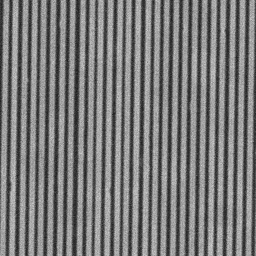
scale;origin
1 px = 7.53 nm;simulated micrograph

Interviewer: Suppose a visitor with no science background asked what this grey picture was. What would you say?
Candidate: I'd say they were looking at parallel lines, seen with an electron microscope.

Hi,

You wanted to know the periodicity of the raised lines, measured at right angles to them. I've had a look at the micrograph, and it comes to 71.2 nm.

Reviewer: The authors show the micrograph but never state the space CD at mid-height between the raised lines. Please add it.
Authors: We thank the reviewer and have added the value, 35.8 nm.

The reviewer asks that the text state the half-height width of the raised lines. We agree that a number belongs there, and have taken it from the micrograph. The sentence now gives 35.8 nm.